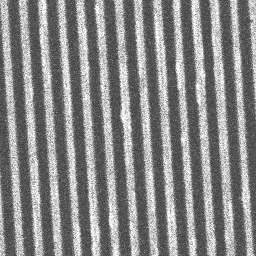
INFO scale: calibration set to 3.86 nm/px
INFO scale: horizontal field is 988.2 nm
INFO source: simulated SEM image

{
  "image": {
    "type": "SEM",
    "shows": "parallel lines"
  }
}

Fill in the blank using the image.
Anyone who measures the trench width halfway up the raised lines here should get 40.4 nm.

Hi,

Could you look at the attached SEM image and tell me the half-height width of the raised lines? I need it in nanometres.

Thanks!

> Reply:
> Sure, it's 33.2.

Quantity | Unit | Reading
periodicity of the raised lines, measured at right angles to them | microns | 0.0737